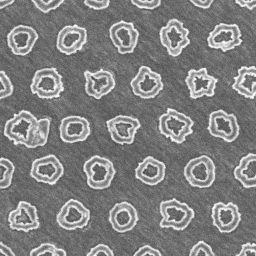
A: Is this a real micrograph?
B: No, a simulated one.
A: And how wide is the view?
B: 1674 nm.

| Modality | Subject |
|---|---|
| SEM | a regular array of ring-shaped raised bodies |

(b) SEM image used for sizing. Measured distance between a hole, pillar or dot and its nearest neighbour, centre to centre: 321 nm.